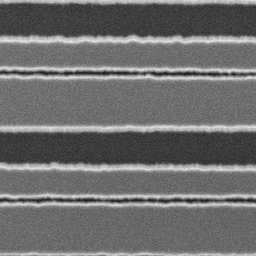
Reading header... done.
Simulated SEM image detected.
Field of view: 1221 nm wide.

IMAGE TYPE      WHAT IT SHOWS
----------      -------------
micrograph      lines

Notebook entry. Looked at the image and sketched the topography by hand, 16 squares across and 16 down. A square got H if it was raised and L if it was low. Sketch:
LLLLLLLLLLLLLLLL
LLLLLLLLLLLLLLLL
LLLLLLLLHLLLLLLL
HHHHHHHHHHHHHHHH
HHHHHHHHHHHHHHHH
HHHHHHHHHHHHHHHH
HHHHHHHHHHHHHHHH
HHHHHHHHHHHHHHHH
LLLLLLLLLLLLLLLL
LLLLLLLLLLLLLLLL
HHHHLLLLHLLLLLLL
HHHHHHHHHHHHHHHH
HHHHHHHHHHHHHHHH
HHHHHHHHHHHHHHHH
HHHHHHHHHHHHHHHH
HHHHHHHHHHHHHHHH